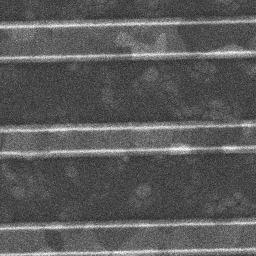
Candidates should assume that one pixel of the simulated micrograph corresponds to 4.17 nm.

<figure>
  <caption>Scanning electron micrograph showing one or a few lines or trenches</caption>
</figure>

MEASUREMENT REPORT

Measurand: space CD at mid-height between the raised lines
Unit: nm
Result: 306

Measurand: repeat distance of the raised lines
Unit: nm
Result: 415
